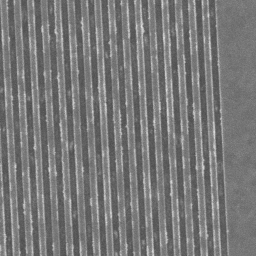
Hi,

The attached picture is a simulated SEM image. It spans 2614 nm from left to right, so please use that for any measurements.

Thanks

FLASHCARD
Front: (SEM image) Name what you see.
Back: parallel lines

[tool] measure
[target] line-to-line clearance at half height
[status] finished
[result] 75.2 nm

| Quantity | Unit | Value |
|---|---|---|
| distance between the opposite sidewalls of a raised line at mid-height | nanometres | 66.3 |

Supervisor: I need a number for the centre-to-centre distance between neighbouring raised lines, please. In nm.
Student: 137